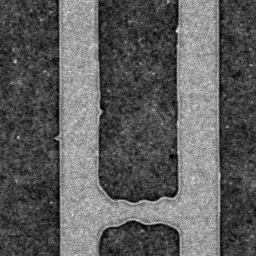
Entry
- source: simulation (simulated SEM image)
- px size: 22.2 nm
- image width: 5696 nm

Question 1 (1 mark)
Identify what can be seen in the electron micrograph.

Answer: one or a few lines or trenches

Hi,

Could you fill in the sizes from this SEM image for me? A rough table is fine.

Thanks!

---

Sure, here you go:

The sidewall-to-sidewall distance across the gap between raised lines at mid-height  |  1800 nm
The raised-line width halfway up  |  865 nanometers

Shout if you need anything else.